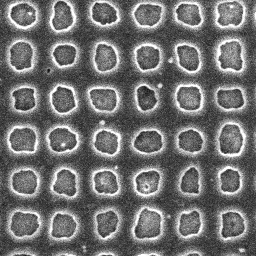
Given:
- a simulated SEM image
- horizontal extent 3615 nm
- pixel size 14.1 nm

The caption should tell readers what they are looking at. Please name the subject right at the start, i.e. a regular array of holes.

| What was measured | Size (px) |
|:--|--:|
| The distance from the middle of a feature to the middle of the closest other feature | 40.6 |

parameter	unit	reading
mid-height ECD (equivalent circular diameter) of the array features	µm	0.356